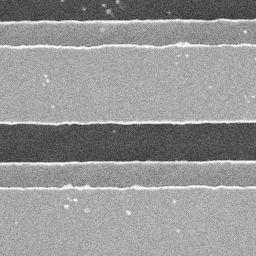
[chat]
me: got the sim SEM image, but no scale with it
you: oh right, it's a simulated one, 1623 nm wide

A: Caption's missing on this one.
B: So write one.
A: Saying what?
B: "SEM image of lines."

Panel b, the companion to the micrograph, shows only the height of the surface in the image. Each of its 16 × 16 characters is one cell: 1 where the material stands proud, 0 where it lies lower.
0000000000000000
1111111111111111
1111111111111111
1111111111111111
1111111111111111
1111111111111111
1111111111111111
1111111111111111
0000000000000000
0000000000000000
1111111111111111
1111111111111111
1111111111111111
1111111111111111
1111111111111111
1111111111111111